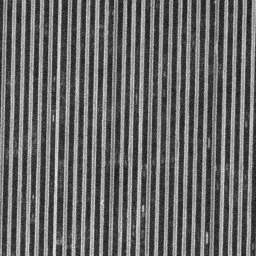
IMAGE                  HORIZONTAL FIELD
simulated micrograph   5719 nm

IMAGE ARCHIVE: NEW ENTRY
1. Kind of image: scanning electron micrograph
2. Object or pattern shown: parallel lines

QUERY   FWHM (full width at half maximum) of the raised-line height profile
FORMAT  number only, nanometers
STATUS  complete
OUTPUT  64.2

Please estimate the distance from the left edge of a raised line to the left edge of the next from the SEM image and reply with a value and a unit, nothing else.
0.206 µm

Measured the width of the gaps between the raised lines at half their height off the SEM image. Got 128 nm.